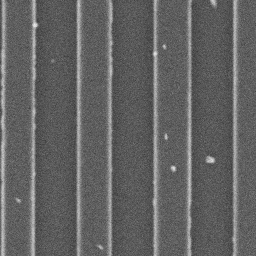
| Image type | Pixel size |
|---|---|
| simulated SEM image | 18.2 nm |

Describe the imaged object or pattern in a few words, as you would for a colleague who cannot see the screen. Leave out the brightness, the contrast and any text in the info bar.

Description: lines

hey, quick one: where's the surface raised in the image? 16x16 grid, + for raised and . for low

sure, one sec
++...++...++...+
++...++...++...+
++...++...++...+
++...++...++...+
++...++...++...+
++...++...++...+
++...++...++...+
++...++...++...+
++...++...++...+
++...++...++...+
++...++...++...+
++...++...++...+
++...++...++...+
++...++...++...+
++...++...++...+
++...++...++...+